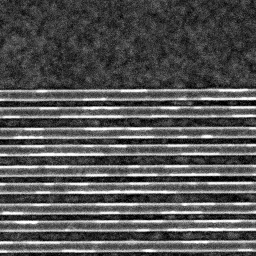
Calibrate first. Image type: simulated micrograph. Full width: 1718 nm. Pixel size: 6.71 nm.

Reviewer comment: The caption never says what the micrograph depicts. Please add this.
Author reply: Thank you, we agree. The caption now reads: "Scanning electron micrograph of parallel lines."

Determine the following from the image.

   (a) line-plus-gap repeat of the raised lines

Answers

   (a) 0.127 microns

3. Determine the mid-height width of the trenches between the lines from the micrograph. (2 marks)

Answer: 49.5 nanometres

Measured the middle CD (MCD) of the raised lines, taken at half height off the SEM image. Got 65.4 nm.